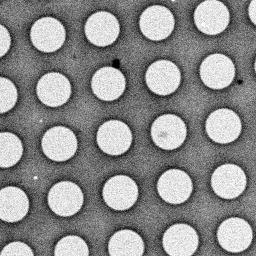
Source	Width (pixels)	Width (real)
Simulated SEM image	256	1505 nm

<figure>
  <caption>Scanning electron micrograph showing an array of small figures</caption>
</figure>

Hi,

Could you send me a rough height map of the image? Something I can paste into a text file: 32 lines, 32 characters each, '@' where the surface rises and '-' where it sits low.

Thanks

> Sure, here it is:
-------------------------@@@---@
------------------@@@---@@@@---@
-----@@----@@@@---@@@@--@@@@@--@
@---@@@@---@@@@---@@@@---@@@----
@---@@@@---@@@@---@@@-----------
@---@@@@----@@------------------
@-------------------------------
--------------------------@@@---
-------------@-----@@@---@@@@---
------@@----@@@---@@@@---@@@@---
@@---@@@@--@@@@@--@@@@----@@@---
@@---@@@@---@@@----@@-----------
@@---@@@-----@------------------
@-------------------------------
--------------------@@----@@@@--
-------------@@----@@@@---@@@@--
------@@@---@@@@---@@@@---@@@@--
@@---@@@@@--@@@@---@@@@----@@---
@@@--@@@@@---@@@----@@----------
@@@---@@@-----------------------
@@------------------------------
---------------------@@----@@@--
--------------@@@---@@@@--@@@@@-
-@-----@@@---@@@@---@@@@---@@@@-
@@@---@@@@---@@@@---@@@@----@@--
@@@@--@@@@---@@@@---------------
@@@----@@@----------------------
@@--------------------------@@--
---------------------@@@---@@@@-
--------------@@@---@@@@@--@@@@-
-@@----@@@@---@@@@--@@@@@---@@@-
@@@@---@@@@---@@@@---@@@--------